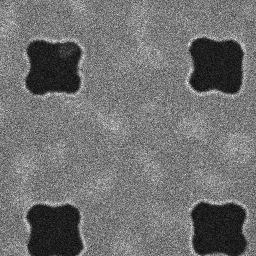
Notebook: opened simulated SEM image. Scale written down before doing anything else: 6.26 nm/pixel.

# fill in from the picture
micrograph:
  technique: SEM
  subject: holes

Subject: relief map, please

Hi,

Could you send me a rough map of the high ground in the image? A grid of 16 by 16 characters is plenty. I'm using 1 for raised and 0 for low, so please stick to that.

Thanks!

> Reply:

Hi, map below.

1111111111111111
1111111111111111
1111111111110111
1100011111110001
1100011111110001
1100011111110001
1111111111111111
1111111111111111
1111111111111111
1111111111111111
1111111111111111
1111111111111111
1111111111111111
1100011111110001
1100011111110001
1100011111110001